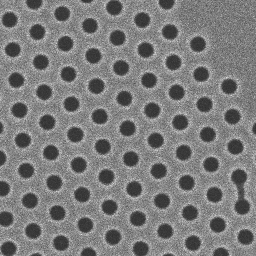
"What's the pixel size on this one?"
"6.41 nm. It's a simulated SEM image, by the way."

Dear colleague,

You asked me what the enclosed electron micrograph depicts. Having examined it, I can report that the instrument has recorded a regular array of holes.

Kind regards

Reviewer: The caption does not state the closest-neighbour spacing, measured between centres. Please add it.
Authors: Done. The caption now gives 193 nm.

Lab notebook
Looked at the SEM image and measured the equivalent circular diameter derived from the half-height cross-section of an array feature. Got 15.8 px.